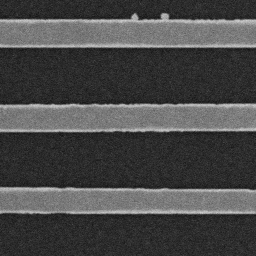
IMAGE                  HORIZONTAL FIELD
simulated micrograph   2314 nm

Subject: lines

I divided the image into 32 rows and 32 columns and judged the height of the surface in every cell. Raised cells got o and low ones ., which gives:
................................
................................
................................
oooooooooooooooooooooooooooooooo
oooooooooooooooooooooooooooooooo
oooooooooooooooooooooooooooooooo
................................
................................
................................
................................
................................
................................
................................
oooooooooooooooooooooooooooooooo
oooooooooooooooooooooooooooooooo
oooooooooooooooooooooooooooooooo
................................
................................
................................
................................
................................
................................
................................
................................
oooooooooooooooooooooooooooooooo
oooooooooooooooooooooooooooooooo
oooooooooooooooooooooooooooooooo
................................
................................
................................
................................
................................